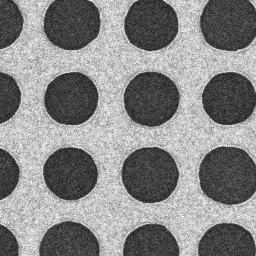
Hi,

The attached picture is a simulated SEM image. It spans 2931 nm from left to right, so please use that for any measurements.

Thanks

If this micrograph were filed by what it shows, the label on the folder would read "holes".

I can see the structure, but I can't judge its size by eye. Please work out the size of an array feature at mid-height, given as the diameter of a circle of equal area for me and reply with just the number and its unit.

630 nanometers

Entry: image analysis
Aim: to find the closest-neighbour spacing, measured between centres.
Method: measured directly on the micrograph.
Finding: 862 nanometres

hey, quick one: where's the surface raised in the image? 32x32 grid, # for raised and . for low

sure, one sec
..####......#####....#####......
...###......####......###.......
...###.......###......###.......
...##........###......###.......
..####......####......###.......
..#####....#####.....#####.....#
################################
################################
################################
.######....######....######....#
..####......####......####.....#
...###......####......###.......
...###......###.......###.......
..####......####......###.......
..####.....#####......####.....#
########..#######...#######..###
################################
################################
########.#########..#######...##
..####.....#####.....#####.....#
..####......###.......###.......
...##.......###.......###.......
..####......###.......###.......
..####......####......###.......
.######....#####.....#####......
############################..##
################################
################################
.#####.....######....#####.....#
..###.......####......###.......
..###.......####......###.......
..###.......###.......###.......